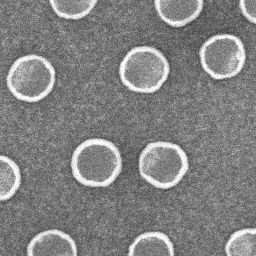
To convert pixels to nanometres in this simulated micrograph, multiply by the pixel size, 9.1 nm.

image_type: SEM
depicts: raised bodies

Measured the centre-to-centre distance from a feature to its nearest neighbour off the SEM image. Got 726 nm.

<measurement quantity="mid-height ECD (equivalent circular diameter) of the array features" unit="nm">404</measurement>